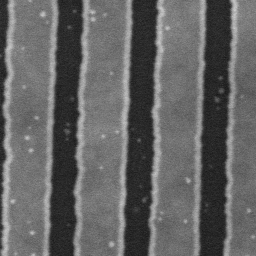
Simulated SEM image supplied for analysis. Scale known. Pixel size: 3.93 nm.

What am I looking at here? lines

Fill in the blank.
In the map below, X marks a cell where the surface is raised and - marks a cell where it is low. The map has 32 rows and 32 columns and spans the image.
-XXXXXX---XXXXXX----XXXXXX---XXX
-XXXXXX---XXXXXX----XXXXXX---XXX
-XXXXXX---XXXXXX----XXXXXX---XXX
-XXXXXX---XXXXXX----XXXXXX---XXX
-XXXXXX---XXXXXX----XXXXXX---XXX
-XXXXXX---XXXXXX----XXXXXX---XXX
-XXXXXX---XXXXXX----XXXXX----XXX
-XXXXXX---XXXXXX---XXXXXXX---XXX
-XXXXXX---XXXXXX---XXXXXXX---XXX
-XXXXXX---XXXXXX---XXXXXX----XXX
-XXXXXX---XXXXXX---XXXXXX----XXX
-XXXXXX---XXXXXX---XXXXXX----XXX
-XXXXXX---XXXXXX---XXXXXX----XXX
XXXXXXX---XXXXXX---XXXXXX----XXX
-XXXXXX---XXXXXX---XXXXXX----XXX
-XXXXXX---XXXXXX---XXXXXX----XXX
-XXXXXX---XXXXXX---XXXXXX---XXXX
-XXXXXX---XXXXXX---XXXXXX---XXXX
-XXXXXX---XXXXXX---XXXXXX---XXXX
-XXXXX----XXXXXX---XXXXXX---XXXX
-XXXXXX---XXXXXX---XXXXXX---XXXX
XXXXXX----XXXXXX---XXXXXX---XXXX
XXXXXX----XXXXXX---XXXXXX---XXXX
XXXXXX---XXXXXXX---XXXXXX---XXXX
XXXXXX---XXXXXXX---XXXXXX---XXXX
XXXXXX---XXXXXXX---XXXXXX---XXXX
XXXXXX---XXXXXX----XXXXXX---XXXX
XXXXXX----XXXXXX---XXXXXX---XXXX
XXXXXX----XXXXXX---XXXXXX---XXXX
XXXXXX---XXXXXX----XXXXXX---XXXX
XXXXXX---XXXXXX----XXXXXX---XXXX
XXXXXX---XXXXXX----XXXXXX---XXXX